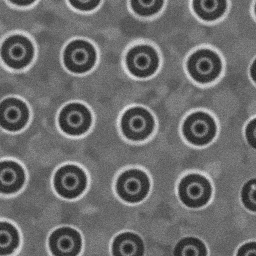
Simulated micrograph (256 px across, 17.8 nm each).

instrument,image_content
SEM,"an array of small figures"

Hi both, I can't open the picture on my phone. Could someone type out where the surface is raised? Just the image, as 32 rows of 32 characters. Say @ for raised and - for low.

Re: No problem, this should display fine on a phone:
@---@@@@@----@@@-----@@@-----@@@
@@@@@@@@@@-@@@@@@---@@@@----@@@@
@@@@@@@@@@@@@@@@@@@@@@@@@--@@@@@
@@@@@@@@@@@@@@@@@@@@@@@@@@@@@@@@
@---@@@@@@@@@@@@@@@@@@@@@@@@@@@@
----@@@@----@@@@@--@@@@@@@@@@@@@
----@@@@----@@@@----@@@@---@@@@@
----@@@@----@@@-----@@@-----@@@@
@--@@@@@----@@@@----@@@-----@@@-
@@@@@@@@@@@@@@@@---@@@@@----@@@-
@@@@@@@@@@@@@@@@@@@@@@@@@-@@@@@@
@@@@@@@@@@@@@@@@@@@@@@@@@@@@@@@@
---@@@@@@@@@@@@@@@@@@@@@@@@@@@@@
----@@@@---@@@@@--@@@@@@@@@@@@@@
----@@@-----@@@----@@@@----@@@@@
---@@@@-----@@@-----@@@----@@@@-
@-@@@@@@---@@@@----@@@@----@@@@-
@@@@@@@@@@@@@@@@--@@@@@----@@@@-
@@@@@@@@@@@@@@@@@@@@@@@@@@@@@@@@
@@@@@@@@@@@@@@@@@@@@@@@@@@@@@@@@
---@@@@@--@@@@@@@@@@@@@@@@@@@@@@
---@@@@----@@@@---@@@@@@-@@@@@@@
---@@@@----@@@-----@@@----@@@@@-
---@@@@----@@@-----@@@-----@@@--
@@@@@@@---@@@@@---@@@@-----@@@--
@@@@@@@@@@@@@@@@-@@@@@@---@@@@--
@@@@@@@@@@@@@@@@@@@@@@@@@@@@@@@-
-@@@@@@@@@@@@@@@@@@@@@@@@@@@@@@@
--@@@@@--@@@@@@@@@@@@@@@@@@@@@@@
---@@@----@@@@---@@@@@@@@@@@@@@@
---@@@----@@@@----@@@@----@@@@--
--@@@@----@@@@----@@@@----@@@@--